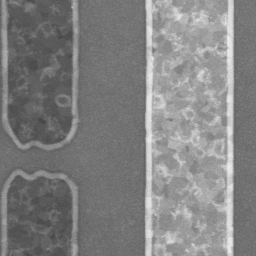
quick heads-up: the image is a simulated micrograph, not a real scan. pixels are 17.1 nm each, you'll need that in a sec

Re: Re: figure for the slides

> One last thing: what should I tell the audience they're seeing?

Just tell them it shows one or a few lines or trenches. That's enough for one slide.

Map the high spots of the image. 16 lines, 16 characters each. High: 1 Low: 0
1111100001111100
1111100001111100
1111100001111100
1111100001111100
1111100001111100
1111100001111100
1111100001111100
1111100001111100
0111000001111100
0000000001111100
0000000001111100
1111000001111100
1111100001111100
1111100001111100
1111100001111100
1111100001111100